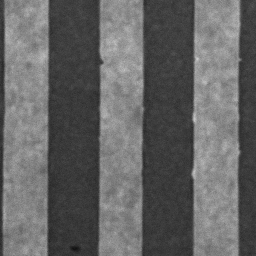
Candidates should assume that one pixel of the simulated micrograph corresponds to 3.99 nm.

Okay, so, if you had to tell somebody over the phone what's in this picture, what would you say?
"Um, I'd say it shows one or a few lines or trenches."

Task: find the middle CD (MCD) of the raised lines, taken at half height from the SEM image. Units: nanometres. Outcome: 172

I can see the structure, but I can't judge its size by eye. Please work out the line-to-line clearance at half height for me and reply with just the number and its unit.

211 nanometers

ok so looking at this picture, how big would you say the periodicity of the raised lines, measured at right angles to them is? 95.3 px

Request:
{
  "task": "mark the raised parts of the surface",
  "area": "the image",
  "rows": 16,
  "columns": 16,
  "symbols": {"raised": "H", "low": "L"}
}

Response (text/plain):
HHHLLLHHHLLLHHHL
HHHLLLHHHLLLHHHL
HHHLLLHHHLLLHHHL
HHHLLLHHHLLLHHHL
HHHLLLHHHLLLHHHL
HHHLLLHHHLLLHHHL
HHHLLLHHHLLLHHHL
HHHLLLHHHLLLHHHL
HHHLLLHHHLLLHHHL
HHHLLLHHHLLLHHHL
HHHLLLHHHLLLHHHL
HHHLLLHHHLLLHHHL
HHHLLLHHHLLLHHHL
HHHLLLHHHLLLHHHL
HHHLLLHHHLLLHHHL
HHHLLLHHHLLLHHHL